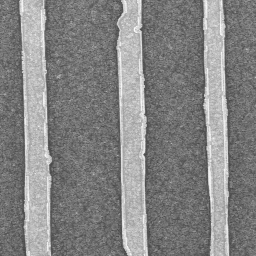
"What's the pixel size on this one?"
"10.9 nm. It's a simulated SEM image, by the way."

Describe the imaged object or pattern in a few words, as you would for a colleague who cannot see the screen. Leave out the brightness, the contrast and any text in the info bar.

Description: one or a few lines or trenches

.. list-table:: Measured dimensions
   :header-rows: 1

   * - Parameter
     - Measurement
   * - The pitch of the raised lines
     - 982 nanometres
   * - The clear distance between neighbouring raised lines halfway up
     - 746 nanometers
